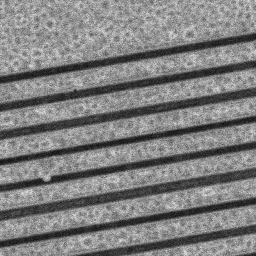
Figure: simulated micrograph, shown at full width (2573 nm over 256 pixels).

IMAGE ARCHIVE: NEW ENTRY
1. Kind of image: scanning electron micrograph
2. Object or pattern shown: parallel lines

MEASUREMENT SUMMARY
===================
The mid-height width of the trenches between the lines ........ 0.0793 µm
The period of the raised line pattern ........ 272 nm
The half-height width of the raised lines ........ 188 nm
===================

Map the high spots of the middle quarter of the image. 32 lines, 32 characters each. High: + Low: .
...........+++++++++++++++++++++
.....+++++++++++++++++++++++++++
++++++++++++++++++++++++++......
++++++++++++++++++++............
++++++++++++++..............++++
+++++++++..............+++++++++
++...............+++++++++++++++
...........+++++++++++++++++++++
.....+++++++++++++++++++++++++++
+++++++++++++++++++++++++.......
+++++++++++++++++++.............
+++++++++++++................+++
+++++++................+++++++++
+................+++++++++++++++
...........+++++++++++++++++++++
.....+++++++++++++++++++++++++++
++++++++++++++++++++++++++......
+++++++++++++++++++++...........
+++++++++++++++...........++++++
+++++++++...........++++++++++++
+++...........++++++++++++++++++
........++++++++++++++++++++++++
..+++++++++++++++++++++++++++...
++++++++++++++++++++++++........
++++++++++++++++++...........+++
++++++++++++...........+++++++++
++++++...........+++++++++++++++
...........+++++++++++++++++++++
.....++++++++++++++++++++++++++.
+++++++++++++++++++++++++.......
+++++++++++++++++++.............
+++++++++++++..................+